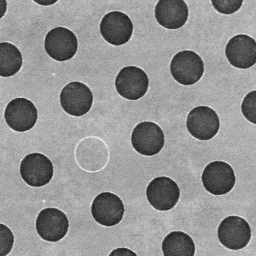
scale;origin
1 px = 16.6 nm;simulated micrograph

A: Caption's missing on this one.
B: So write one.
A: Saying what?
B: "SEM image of a regular array of holes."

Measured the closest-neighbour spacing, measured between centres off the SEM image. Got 951 nanometres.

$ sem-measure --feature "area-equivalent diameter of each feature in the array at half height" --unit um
0.573